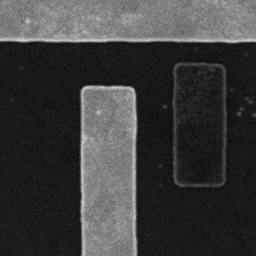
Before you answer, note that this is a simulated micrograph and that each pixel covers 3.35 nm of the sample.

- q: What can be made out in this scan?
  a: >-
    wiring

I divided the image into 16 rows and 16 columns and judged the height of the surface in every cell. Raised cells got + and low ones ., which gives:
++++++++++++++++
++++++++++++++++
.++++++.++.+++++
................
...........+++..
......+....+++..
.....+++...+++..
.....+++...+++..
.....+++...+++..
.....+++...+++..
.....+++...+++..
.....+++...+++..
.....+++........
.....+++........
.....+++........
.....+++........